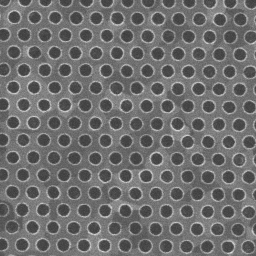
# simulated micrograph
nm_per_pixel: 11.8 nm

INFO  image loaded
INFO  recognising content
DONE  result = a regular array of holes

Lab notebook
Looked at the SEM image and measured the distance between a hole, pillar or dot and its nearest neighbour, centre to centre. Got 0.236 um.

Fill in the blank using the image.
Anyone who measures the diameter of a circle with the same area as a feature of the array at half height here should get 152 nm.